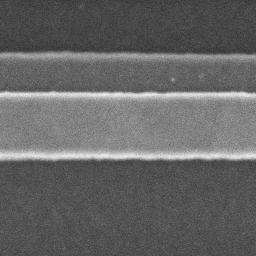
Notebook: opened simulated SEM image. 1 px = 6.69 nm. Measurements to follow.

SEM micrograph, lines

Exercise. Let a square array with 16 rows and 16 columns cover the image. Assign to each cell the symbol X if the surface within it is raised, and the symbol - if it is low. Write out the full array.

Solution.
----------------
----------------
----------------
XXXXXX-XX--X----
XXXXXXXXXXXXXXXX
XXXXXXXXXXXXXXXX
XXXXXXXXXXXXXXXX
XXXXXXXXXXXXXXXX
XXXXXXXXXXXXXXXX
XXXXXXXXXXXXXXXX
----------------
----------------
----------------
----------------
----------------
----------------